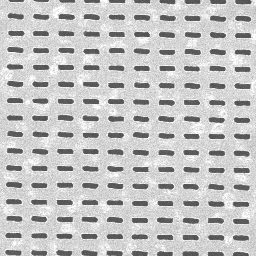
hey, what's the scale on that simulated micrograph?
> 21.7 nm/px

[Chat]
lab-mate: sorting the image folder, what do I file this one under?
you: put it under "a regular array of holes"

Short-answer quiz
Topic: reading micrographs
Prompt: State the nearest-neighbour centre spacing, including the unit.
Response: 362 nm